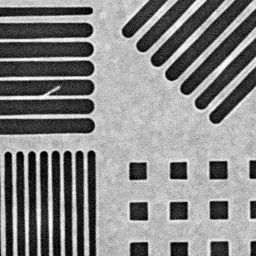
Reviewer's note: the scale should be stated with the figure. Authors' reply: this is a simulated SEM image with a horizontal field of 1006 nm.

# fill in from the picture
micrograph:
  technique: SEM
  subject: groups of lines, slits or small figures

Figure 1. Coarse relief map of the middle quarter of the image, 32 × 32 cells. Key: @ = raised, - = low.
--------@@@@@@@@@@@@@@---@------
--------@@@@@@@@@@@@@@@@@------@
-------@@@@@@@@@@@@@@@@@@-----@@
------@@@@@@@@@@@@@@@@@@@----@@-
-------@@@@@@@@@@@@@@@@@@@@@@@--
--------@@@@@@@@@@@@@@@@@@@@@---
--------@@@@@@@@@@@@@@@@@@@@@---
-------@@@@@@@@@@@@@@@@@@@@@@@--
------@@@@@@@@@@@@@@@@@@@@@@@@@@
--------@@@@@@@@@@@@@@@@@@@@@@@@
--------@@@@@@@@@@@@@@@@@@@@@@@@
--------@@@@@@@@@@@@@@@@@@@@@@@@
------@@@@@@@@@@@@@@@@@@@@@@@@@@
------@@@@@@@@@@@@@@@@@@@@@@@@@@
--------@@@@@@@@@@@@@@@@@@@@@@@@
--------@@@@@@@@@@@@@@@@@@@@@@@@
--------@@@@@@@@@@@@@@@@@@@@@@@@
@@@@@@@@@@@@@@@@@@@@@@@@@@@@@@@@
@@@@@@@@@@@@@@@@@@@@@@@@@@@@@@@@
@@@@@@@@@@@@@@@@@@@@@@@@@@@@@@@@
@@@@@@@@@@@@@@@@@@@@@@@@@@@@@@@@
@@@@@@@@@@@@@@@@@@@@@@@@@@@@@@@@
--@--@--@@@@@@@@@@@@@@@@@@@@@@@@
--@--@--@@@@@@@@@@@@@@@@@@@@@@@@
-----@--@@@@@@@@@---@@@@@@@----@
-----@--@@@@@@@@-----@@@@@-----@
-----@--@@@@@@@@-----@@@@@-----@
-----@--@@@@@@@@-----@@@@@-----@
-----@--@@@@@@@@-----@@@@@-----@
-----@--@@@@@@@@@@@@@@@@@@@@@@@@
-----@--@@@@@@@@@@@@@@@@@@@@@@@@
-----@--@@@@@@@@@@@@@@@@@@@@@@@@